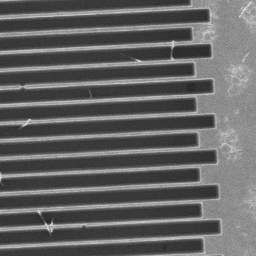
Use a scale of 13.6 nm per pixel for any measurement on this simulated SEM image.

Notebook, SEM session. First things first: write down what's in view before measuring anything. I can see parallel lines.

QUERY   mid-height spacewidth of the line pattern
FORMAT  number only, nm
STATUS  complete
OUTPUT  160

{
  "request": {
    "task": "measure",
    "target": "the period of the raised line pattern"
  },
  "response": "240 nm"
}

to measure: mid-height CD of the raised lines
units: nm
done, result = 79.9